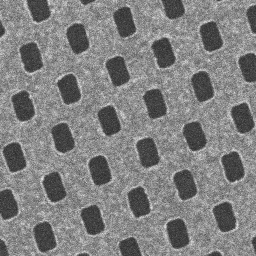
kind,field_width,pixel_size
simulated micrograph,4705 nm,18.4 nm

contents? a regular array of holes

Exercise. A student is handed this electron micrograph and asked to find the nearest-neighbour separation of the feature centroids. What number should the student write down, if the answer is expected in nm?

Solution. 906